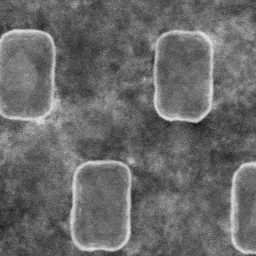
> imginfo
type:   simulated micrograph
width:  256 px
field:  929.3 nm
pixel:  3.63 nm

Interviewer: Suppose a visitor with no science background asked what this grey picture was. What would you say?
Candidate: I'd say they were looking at raised bodies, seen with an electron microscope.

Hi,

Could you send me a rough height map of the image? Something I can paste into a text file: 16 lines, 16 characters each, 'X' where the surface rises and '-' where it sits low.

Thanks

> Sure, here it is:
----------------
----------------
XXX-------XXX---
XXX-------XXX---
XXX-------XXX---
XXX-------XXX---
XXX-------XXX---
----------------
----------------
----------------
-----XXX-------X
-----XXX-------X
-----XXX-------X
----XXXX-------X
-----XXX-------X
-----XX--------X